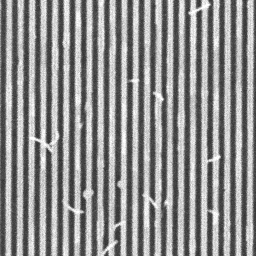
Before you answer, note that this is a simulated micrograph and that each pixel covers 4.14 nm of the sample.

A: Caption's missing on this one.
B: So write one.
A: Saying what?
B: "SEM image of parallel lines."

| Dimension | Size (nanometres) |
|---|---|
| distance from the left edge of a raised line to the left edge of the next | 47.6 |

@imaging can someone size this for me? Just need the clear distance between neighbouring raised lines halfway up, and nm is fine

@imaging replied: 23.8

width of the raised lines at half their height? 23.3 nm